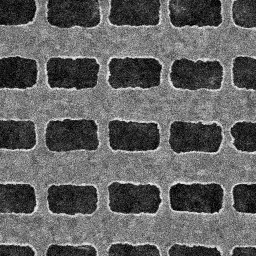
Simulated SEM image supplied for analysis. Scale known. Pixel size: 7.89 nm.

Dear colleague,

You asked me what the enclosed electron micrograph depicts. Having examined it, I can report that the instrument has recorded a regular array of holes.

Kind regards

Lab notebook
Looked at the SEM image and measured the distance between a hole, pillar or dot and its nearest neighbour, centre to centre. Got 484 nm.